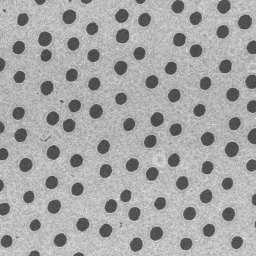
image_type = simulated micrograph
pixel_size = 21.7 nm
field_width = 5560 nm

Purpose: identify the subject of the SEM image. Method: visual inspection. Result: a regular array of holes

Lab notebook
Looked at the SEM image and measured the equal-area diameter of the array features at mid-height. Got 291 nanometers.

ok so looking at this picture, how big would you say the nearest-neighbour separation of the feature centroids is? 0.527 µm